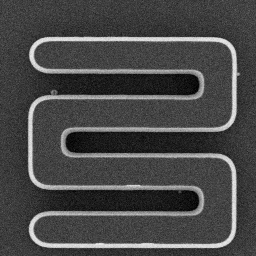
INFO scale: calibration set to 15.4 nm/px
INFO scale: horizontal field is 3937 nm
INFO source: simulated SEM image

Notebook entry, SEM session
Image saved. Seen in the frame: groups of lines, slits or small figures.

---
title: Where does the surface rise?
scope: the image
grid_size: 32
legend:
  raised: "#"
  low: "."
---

................................
................................
................................
................................
................................
.....#######################....
....#########################...
....#########################...
.....########################...
.........................####...
.........................####...
.........................####...
.....########################...
....#########################...
....#########################...
....#########################...
....#####.......................
....####........................
....####........................
....########################....
....#########################...
....#########################...
....#########################...
........................#####...
.........................####...
.........................####...
........................#####...
....#########################...
....#########################...
....#########################...
.....#######################....
................................